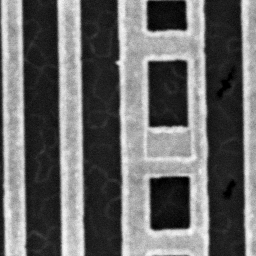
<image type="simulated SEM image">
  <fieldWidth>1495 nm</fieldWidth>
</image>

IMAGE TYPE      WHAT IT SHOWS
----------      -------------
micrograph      one or a few lines or trenches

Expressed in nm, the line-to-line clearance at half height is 249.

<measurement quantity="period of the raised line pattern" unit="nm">358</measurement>